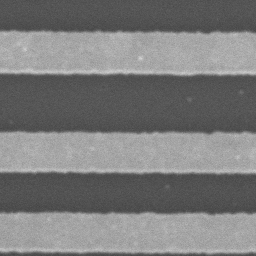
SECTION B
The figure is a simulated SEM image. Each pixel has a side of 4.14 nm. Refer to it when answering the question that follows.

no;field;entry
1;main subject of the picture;lines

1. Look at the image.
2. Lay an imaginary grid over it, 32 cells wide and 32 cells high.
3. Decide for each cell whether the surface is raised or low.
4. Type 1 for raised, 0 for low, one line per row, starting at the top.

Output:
00000000000000000000000000000000
00000000000000000000000000000000
00000000000000000000000000000000
00000000000000000000000000000000
11111111111111111111111111111111
11111111111111111111111111111111
11111111111111111111111111111111
11111111111111111111111111111111
11111111111111111111111111111111
00000000000000000000000000000000
00000000000000000000000000000000
00000000000000000000000000000000
00000000000000000000000000000000
00000000000000000000000000000000
00000000000000000000000000000000
00000000000000000000000000000000
00100000000000000000000000000000
11111111111111111111111111111111
11111111111111111111111111111111
11111111111111111111111111111111
11111111111111111111111111111111
00000000000000000100001000011111
00000000000000000000000000000000
00000000000000000000000000000000
00000000000000000000000000000000
00000000000000000000000000000000
00000000000000000000000000000000
11111111111111111111111111111111
11111111111111111111111111111111
11111111111111111111111111111111
11111111111111111111111111111111
00000000000000000010000100100000